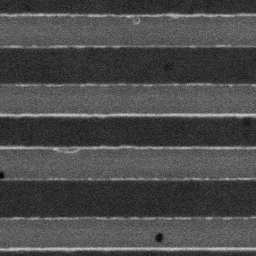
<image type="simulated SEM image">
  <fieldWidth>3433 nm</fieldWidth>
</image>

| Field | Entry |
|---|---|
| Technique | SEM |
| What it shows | lines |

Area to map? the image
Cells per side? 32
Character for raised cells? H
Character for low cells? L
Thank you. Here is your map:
HHHHHHHHHHHHHHHHHHHHHHHHHHHHHHHH
HHHHHHHHHHHHHHHHHHHHHHHHHHHHHHHH
LLLLLLLLLLLLLLLLLLLLLLLLLLLLLLLL
LLLLLLLLLLLLLLLLLLLLLLLLLLLLLLLL
LLLLLLLLLLLLLLLLLLLLLLLLLLLLLLLL
LLLLLLLLLLLLLLLLLLLLLLLLLLLLLLLL
HHHHHHHHHHHHHHHHHHHHHHHHHHHHHHHH
HHHHHHHHHHHHHHHHHHHHHHHHHHHHHHHH
HHHHHHHHHHHHHHHHHHHHHHHHHHHHHHHH
HHHHHHHHHHHHHHHHHHHHHHHHHHHHHHHH
HHHHHHHHHHHHHHHHHHHHHHHHHHHHHHHH
LLLLLLLLLLLLLLLLLLLLLLLLLLLLLLLL
LLLLLLLLLLLLLLLLLLLLLLLLLLLLLLLL
LLLLLLLLLLLLLLLLLLLLLLLLLLLLLLLL
HHHHHHHHHHHHHHHHHHHHHHHHHHHHHHHH
HHHHHHHHHHHHHHHHHHHHHHHHHHHHHHHH
HHHHHHHHHHHHHHHHHHHHHHHHHHHHHHHH
HHHHHHHHHHHHHHHHHHHHHHHHHHHHHHHH
HHHHHHHHHHHHHHHLLHHHHHHHHHHHHHHH
LLLLLLLLLLLLLLLLLLLLLLLLLLLLLLLL
LLLLLLLLLLLLLLLLLLLLLLLLLLLLLLLL
LLLLLLLLLLLLLLLLLLLLLLLLLLLLLLLL
HHHHHHHHHHHHHHHHHHHHHHHHHHHHHHHH
HHHHHHHHHHHHHHHHHHHHHHHHHHHHHHHH
HHHHHHHHHHHHHHHHHHHHHHHHHHHHHHHH
HHHHHHHHHHHHHHHHHHHHHHHHHHHHHHHH
HHHHHHHHHHHHHHHHHHHHHHHHHHHHHHHH
LLLLLLLLLLLLLLLLLLLLLLLLLLLLLLLL
LLLLLLLLLLLLLLLLLLLLLLLLLLLLLLLL
LLLLLLLLLLLLLLLLLLLLLLLLLLLLLLLL
LLLLLLLLLLLLLLLLLLLLLLLLLLLLLLLL
HHHHHHHHHHHHHHHHHHHHHHHHHHHHHHHH